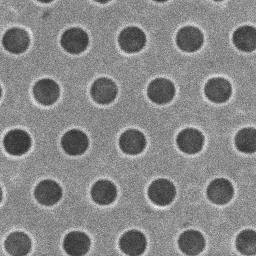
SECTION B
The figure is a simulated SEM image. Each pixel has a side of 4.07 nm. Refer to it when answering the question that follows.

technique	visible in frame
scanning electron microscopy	a regular array of holes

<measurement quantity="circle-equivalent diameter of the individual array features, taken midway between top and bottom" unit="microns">0.117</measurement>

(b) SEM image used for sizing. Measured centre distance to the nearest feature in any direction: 234 nanometres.